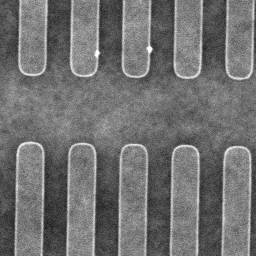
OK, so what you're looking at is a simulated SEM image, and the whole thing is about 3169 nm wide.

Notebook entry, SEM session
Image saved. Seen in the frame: groups of lines, slits or small figures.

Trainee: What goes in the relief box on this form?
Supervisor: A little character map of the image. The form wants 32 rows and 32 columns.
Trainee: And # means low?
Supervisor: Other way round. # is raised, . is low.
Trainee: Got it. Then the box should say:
..####...###...####...###...####
..####...###...####...###...####
..####...###...####...###...####
..####...###...####...###...####
..####...###...####...###...####
..####...###...####...###...####
..####...###...####...###...####
..####...###...####...###...####
..####...###...####...###...####
................##....##.....##.
................................
................................
................................
................................
................................
................................
................................
................................
..###....###...###....##.....##.
..###....###...###....###...###.
..###....###...###....###...###.
..###....###...###....###...###.
..###....###...###....###...###.
..###....###...###...####...###.
..###...####...###...####...###.
..###...####...###...####...###.
..###...####...###...####...###.
..###...####...###...####...###.
..###...####...###...####...###.
..###...####...###...####...###.
..###...####...###...####...###.
..###...####...###...####...###.